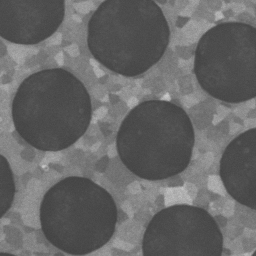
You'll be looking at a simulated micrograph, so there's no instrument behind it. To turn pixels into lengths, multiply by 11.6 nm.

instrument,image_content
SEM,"holes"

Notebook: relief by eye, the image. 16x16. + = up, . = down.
....++....++++++
....++....++++.+
...++......+....
++++++....++....
++..+++..+++....
+....++++++++...
+.....+++..+++++
+.....++....++++
+....++.....+++.
+++++++.....++..
.+++++++....++..
.++...++++++++..
.++....++++++++.
++.....+++...+++
+++....++.....++
++++..+++.....++